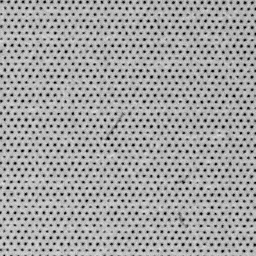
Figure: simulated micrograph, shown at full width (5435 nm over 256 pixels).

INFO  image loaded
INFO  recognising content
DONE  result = a regular array of holes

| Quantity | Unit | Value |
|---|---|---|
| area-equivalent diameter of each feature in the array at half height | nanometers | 53.6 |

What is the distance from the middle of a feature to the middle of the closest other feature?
6.71 pixels